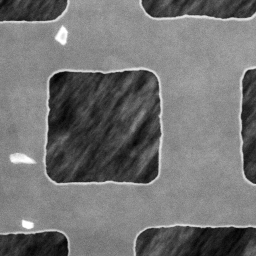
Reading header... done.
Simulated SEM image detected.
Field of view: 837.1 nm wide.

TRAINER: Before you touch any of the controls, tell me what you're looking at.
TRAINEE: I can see holes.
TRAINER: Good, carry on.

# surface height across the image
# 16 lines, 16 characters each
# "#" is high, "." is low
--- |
....#####.......
################
################
################
####..#..######.
###.......#####.
###.......#####.
###.......#####.
###.......#####.
###.......#####.
###.......#####.
########.#######
################
################
##..#####.......
....####........